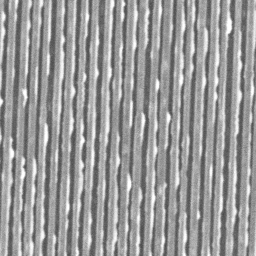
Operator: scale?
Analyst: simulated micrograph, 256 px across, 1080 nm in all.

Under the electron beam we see parallel lines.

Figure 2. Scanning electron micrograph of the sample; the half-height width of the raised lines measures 32.7 nm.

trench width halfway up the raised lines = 18.4 nm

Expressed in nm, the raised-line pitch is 50.3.